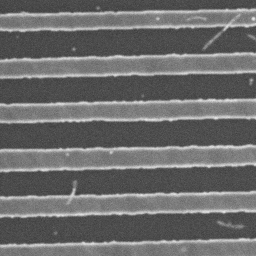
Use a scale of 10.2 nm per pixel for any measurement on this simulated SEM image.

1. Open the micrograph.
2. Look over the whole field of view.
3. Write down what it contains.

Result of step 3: lines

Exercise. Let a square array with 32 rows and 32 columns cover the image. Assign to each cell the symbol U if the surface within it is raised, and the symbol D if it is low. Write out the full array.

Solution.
DDDDDDDDDDDDDDDDDDDDDDDDDDDDDDDD
DDDDDDDDDDDDDDDDDUUUUUUUUUUUUUUU
UUUUUUUUUUUUUUUUUUUUUUUUUUUUUUUU
UUUUUUUUUUUUUUUUUDDDDDDDDDDDDDDD
DDDDDDDDDDDDDDDDDDDDDDDDDDDDDDDD
DDDDDDDDDDDDDDDDDDDDDDDDDDDDDDDD
DDDDDDDDDDDDDDDDDDDDDDDDDDDDDDDD
UUUUUUUUUUUUUUUUUUUUUUUUUUUUUUUU
UUUUUUUUUUUUUUUUUUUUUUUUUUUUUUUU
UUUUUUUUUDDDDDDDDDDDDDDDDDDDDDDD
DDDDDDDDDDDDDDDDDDDDDDDDDDDDDDDD
DDDDDDDDDDDDDDDDDDDDDDDDDDDDDDDD
DDDDDDDDDDDDDDDDDDDDDDDDUUUDUUUU
UUUUUUUUUUUUUUUUUUUUUUUUUUUUUUUU
UUUUUUUUUUUUUUUUUUUUUUUUUUUUUUUU
DDDDDDDDDDDDDDDDDDDDDDDDDDDDDDDD
DDDDDDDDDDDDDDDDDDDDDDDDDDDDDDDD
DDDDDDDDDDDDDDDDDDDDDDDDDDDDDDDD
DDDDDDDDDDDDUDUUUUUUUUUUUUUUUUUU
UUUUUUUUUUUUUUUUUUUUUUUUUUUUUUUU
UUUUUUUUUUUUUUUUUUUUUUUUUUUUUUUU
DDDDDDDDDDDDDDDDDDDDDDDDDDDDDDDD
DDDDDDDDDDDDDDDDDDDDDDDDDDDDDDDD
DDDDDDDDDDDDDDDDDDDDDDDDDDDDDDDD
DDDDDDDDUUUUUUUUUUUUUUUUUUUUUUUU
UUUUUUUUUUUUUUUUUUUUUUUUUUUUUUUU
UUUUUUUUUUUUUUUUUUUUUUUUUUUUUDDD
DDDDDDDDDDDDDDDDDDDDDDDDDDDDDDDD
DDDDDDDDDDDDDDDDDDDDDDDDDDDDDDDD
DDDDDDDDDDDDDDDDDDDDDDDDDDDDDDDD
DDDDDDDUUUUUUUUUUUUUUUUUUUUUUUUU
UUUUUUUUUUUUUUUUUUUUUUUUUUUUUUUU